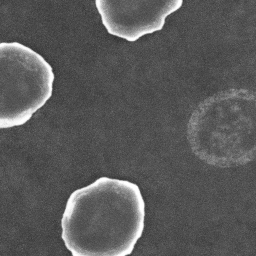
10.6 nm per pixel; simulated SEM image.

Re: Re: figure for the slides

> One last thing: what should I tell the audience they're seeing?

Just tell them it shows raised bodies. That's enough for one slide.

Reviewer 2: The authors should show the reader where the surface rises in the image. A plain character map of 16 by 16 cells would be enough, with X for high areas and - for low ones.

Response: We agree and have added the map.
------XXXXX-----
-------XXX------
----------------
XX--------------
XXX-------------
XXX-------------
XXX-------------
X---------------
----------------
----------------
----------------
------XX--------
----XXXXX-------
----XXXXX-------
----XXXXX-------
----XXXX--------